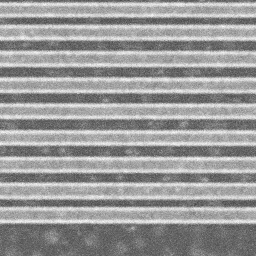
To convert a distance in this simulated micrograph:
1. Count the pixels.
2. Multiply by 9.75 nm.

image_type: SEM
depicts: parallel lines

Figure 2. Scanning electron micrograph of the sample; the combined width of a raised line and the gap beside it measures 250 nanometres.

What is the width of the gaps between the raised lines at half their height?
135 nanometers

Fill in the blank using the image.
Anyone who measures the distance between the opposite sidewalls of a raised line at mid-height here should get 119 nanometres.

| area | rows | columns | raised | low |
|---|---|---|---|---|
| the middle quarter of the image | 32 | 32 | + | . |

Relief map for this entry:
................................
................................
................................
................................
++++++++++++++++++++++++++++++++
++++++++++++++++++++++++++++++++
++++++++++++++++++++++++++++++++
................................
................................
................................
.++........+++++++++++++++++++++
++++++++++++++++++++++++++++++++
++++++++++++++++++++++++++++++++
................................
................................
................................
................................
++++++++++++++++++++++++++++++++
++++++++++++++++++++++++++++++++
++++++++++++++++++++++++++++++++
................................
................................
................................
................................
++++++++++++++++++++++++++++++++
++++++++++++++++++++++++++++++++
++++++++++++++++++++++++++++++++
................................
................................
................................
++++++++++++++++++++++++++++++++
++++++++++++++++++++++++++++++++